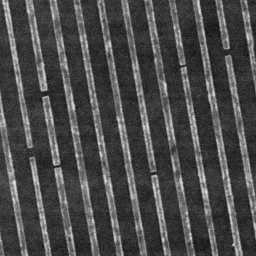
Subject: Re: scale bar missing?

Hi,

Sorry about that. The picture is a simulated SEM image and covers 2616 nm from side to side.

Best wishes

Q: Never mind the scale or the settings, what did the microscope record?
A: parallel lines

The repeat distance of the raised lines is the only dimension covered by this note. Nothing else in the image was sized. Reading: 239 nm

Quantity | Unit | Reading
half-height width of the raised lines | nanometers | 59.2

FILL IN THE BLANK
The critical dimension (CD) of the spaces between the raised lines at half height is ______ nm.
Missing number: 181